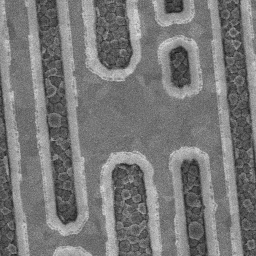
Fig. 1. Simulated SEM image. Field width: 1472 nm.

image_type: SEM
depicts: one or a few lines or trenches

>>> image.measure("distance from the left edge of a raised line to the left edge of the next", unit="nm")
355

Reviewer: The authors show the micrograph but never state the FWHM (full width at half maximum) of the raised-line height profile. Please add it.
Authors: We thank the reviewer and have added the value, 160 nm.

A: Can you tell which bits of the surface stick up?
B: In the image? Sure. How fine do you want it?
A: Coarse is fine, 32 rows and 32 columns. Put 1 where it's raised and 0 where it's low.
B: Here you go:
11110000111000001111000011100001
11110000111000000111000011100001
11110000111000000111111111100001
11110000111000000111111111100001
11110000111000000111111111100001
11110000111000000111110111100001
11110000111100000111100011100001
01111000111100000111100011100001
01111000011100001111100011100001
01111000011111111111100011110000
01111000011111111111100011110000
01111000011111111111110111110000
01111000011111111111111111110000
01111000011111111111111111110000
01111000011111111111111111110000
01111000011111111111111111110000
01111000011111111111111111110000
00111100001111111111111111110000
00111100001111111111111111110000
00111100001111111111111001111000
00111100001111000011110001111000
00111100001110000001110000111000
00111100001110000001110000111000
00111100001110000001110000111000
00111100001110000001110000111000
00111100001111000001110000111000
00111100001111000001110000111000
00011110001111000001111000111000
00011111011111000001111000111000
00011111111111000000111000111100
00011111111111000000111000011100
00011111111111000000111000011100